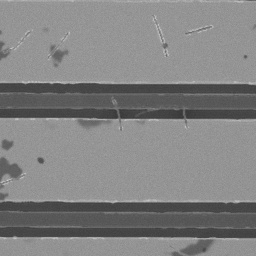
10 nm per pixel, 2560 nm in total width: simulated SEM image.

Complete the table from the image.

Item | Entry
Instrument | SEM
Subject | lines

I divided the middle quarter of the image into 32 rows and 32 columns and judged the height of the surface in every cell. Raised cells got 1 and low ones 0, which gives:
11111111111111111111111111111111
11111111111111111111111111111111
11111111111111111111111111111111
11111111111111111111111111111111
11111111111111111111111111111111
00000000000000000000000000000000
00000000000000000000000000000000
00000000000000000000000000000000
11111111111111111111111111111111
11111111111111111111111111111111
11111111111111111111111111111111
00000000000001000000001000000000
00000000000000000000000000000000
00000000000001000000000000000010
11111111111111111111111111111111
11111111111111111111111111111111
11111111111111111111111111111111
11111111111111111111111111111111
11111111111111111111111111111111
11111111111111111111111111111111
11111111111111111111111111111111
11111111111111111111111111111111
11111111111111111111111111111111
11111111111111111111111111111111
11111111111111111111111111111111
11111111111111111111111111111111
11111111111111111111111111111111
11111111111111111111111111111111
11111111111111111111111111111111
11111111111111111111111111111111
11111111111111111111111111111111
11111111111111111111111111111111